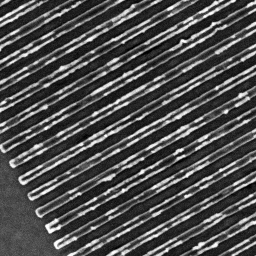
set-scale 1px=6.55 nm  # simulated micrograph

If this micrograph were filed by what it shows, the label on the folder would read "parallel lines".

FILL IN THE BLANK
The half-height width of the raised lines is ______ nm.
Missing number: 55.7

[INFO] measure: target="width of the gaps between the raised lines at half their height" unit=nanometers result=68.5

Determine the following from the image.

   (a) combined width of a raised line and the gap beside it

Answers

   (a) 18.5 pixels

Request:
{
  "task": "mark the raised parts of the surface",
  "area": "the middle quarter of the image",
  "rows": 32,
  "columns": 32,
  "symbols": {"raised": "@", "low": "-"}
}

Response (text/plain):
@@@@@-----@@@@-----@@@@------@@@
@@@-----@@@@-----@@@@@-----@@@@-
@-----@@@@-----@@@@@-----@@@@---
-----@@@------@@@@-----@@@@-----
---@@@@-----@@@@------@@@------@
-@@@@-----@@@@-----@@@@@-----@@@
@@@-----@@@@@-----@@@@------@@@-
@------@@@@-----@@@@------@@@@--
-----@@@@-----@@@@------@@@@----
---@@@@------@@@@-----@@@@------
-@@@@@-----@@@@-----@@@@------@@
@@@@-----@@@@------@@@@-----@@@@
@@-----@@@@------@@@@-----@@@@--
------@@@------@@@@@-----@@@@---
----@@@@------@@@------@@@------
--@@@@------@@@@-----@@@@-----@@
@@@@------@@@@-----@@@@-----@@@@
@@------@@@@-----@@@@------@@@@-
@-----@@@@------@@@------@@@@---
-----@@@@-----@@@@-----@@@@-----
---@@@@-----@@@@-----@@@@------@
-@@@@-----@@@@------@@@@----@@@@
@@@-----@@@@@-----@@@@-----@@@@@
@------@@@@-----@@@@-----@@@@@--
-----@@@@------@@@@----@@@@@----
---@@@@------@@@@-----@@@@------
--@@@------@@@@----@@@@@------@@
@@@------@@@@-----@@@@@-----@@@@
@@------@@@@-----@@@@-----@@@@--
------@@@------@@@@-----@@@@----
----@@@@-----@@@@------@@@@-----
--@@@@-----@@@@@-----@@@@-----@@